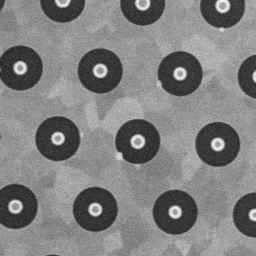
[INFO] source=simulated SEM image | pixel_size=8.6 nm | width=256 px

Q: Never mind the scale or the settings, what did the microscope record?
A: an array of small figures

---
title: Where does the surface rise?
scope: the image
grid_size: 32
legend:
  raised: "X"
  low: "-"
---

-XXXX--X---XXXX--XX--XXXX--X---X
XXXXX-----XXXXX-----XXXXX------X
XXXXXX---XXXXXXX----XXXXXX----XX
XXXXXXXXXXXXXXXXXXXXXXXXXXX--XXX
XXXXXXXXXXXXXXXXXXXXXXXXXXXXXXXX
XXXXXXXXXXXXXXXXXXXXXXXXXXXXXXXX
X----XXXXXX---XXXXXXXX-XXXXXXXXX
-----XXXXX-----XXXXX-----XXXXXX-
--X--XXXXX--X--XXXXX-----XXXXX--
-----XXXXX--X--XXXXX--X--XXXXX--
X----XXXXX-----XXXXX-----XXXXX--
XXXXXXXXXXX---XXXXXXX---XXXXXX--
XXXXXXXXXXXXXXXXXXXXXXXXXXXXXXXX
XXXXXXXXXXXXXXXXXXXXXXXXXXXXXXXX
XXXXXXXXXXXXXXXXXXXXXXXXXXXXXXXX
XXXXX----XXXXXX----XXXXXXX--XXXX
XXXXX-----XXXXX-----XXXXX-----XX
XXXX---X--XXXX---X--XXXX------XX
XXXXX-----XXXX------XXXX---X--XX
XXXXX----XXXXXX----XXXXXX-----XX
XXXXXXXXXXXXXXXXXXXXXXXXXX---XXX
XXXXXXXXXXXXXXXXXXXXXXXXXXXXXXXX
XXXXXXXXXXXXXXXXXXXXXXXXXXXXXXXX
---XXXXXXXX--XXXXXXXXXXXXXXXXXXX
----XXXXXX----XXXXXX----XXXXXX--
-X---XXXX------XXXX------XXXX---
-----XXXX--X---XXXX--XX--XXXX---
----XXXXX-----XXXXX------XXXX---
X--XXXXXXX----XXXXXX----XXXXXX--
XXXXXXXXXXXXXXXXXXXXXXXXXXXXXXX-
XXXXXXXXXXXXXXXXXXXXXXXXXXXXXXXX
XXXXXXXXXXXXXXXXXXXXXXXXXXXXXXXX